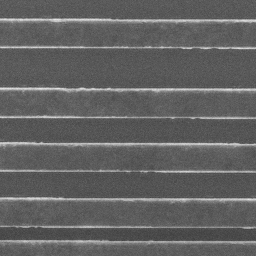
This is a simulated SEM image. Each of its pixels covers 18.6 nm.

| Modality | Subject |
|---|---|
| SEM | lines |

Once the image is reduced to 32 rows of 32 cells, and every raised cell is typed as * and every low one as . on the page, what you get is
................................
................................
**..............................
********************************
********************************
********************************
................................
................................
................................
................................
................................
********************************
********************************
********************************
********************************
................................
................................
................................
********************************
********************************
********************************
................................
................................
................................
................................
********************************
********************************
********************************
..............................**
................................
********************************
********************************